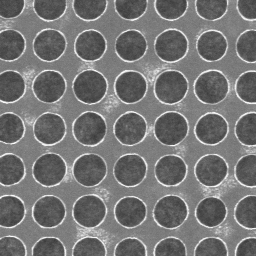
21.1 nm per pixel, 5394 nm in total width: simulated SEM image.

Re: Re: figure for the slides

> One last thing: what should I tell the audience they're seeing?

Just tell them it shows a regular array of holes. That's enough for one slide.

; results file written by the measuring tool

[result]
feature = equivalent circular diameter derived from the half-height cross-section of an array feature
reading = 676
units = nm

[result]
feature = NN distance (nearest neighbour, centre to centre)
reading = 853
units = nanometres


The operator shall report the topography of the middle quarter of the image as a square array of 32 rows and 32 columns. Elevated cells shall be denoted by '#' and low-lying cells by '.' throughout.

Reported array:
################################
######.#########################
####.....#####.....#####.....###
###.......####......###.......##
###........##........##........#
.#.........##........##........#
##.........##........##........#
###.......###.......###.......##
###.......####.....####.......##
#####...#######...#######...####
################################
################################
#####...#######...#######....###
####......####......####......##
###.......###.......###........#
##.........##........##........#
##.........#.........#.........#
##........###.......###........#
###.......###.......###.......##
####.....#####.....#####.....###
################################
################################
################################
####.....#####.....#####.....###
###.......###.......###.......##
##.........##........##........#
.#.........#.........##........#
##........###.......###........#
###.......###.......###.......##
###......#####.....#####.....###
#####..#########.###############
################################